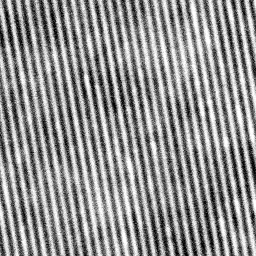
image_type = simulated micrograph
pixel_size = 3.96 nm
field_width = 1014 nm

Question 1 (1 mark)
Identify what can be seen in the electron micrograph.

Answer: parallel lines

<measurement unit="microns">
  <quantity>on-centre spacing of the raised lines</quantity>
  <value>0.0357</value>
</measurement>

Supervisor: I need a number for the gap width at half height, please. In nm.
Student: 28.3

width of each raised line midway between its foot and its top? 7.3 nanometers